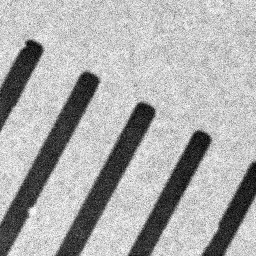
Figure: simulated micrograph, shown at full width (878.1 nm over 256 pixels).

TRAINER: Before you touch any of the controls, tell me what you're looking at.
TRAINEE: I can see one or a few lines or trenches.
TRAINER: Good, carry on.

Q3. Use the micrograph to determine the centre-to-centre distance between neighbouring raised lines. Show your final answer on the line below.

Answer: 218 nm